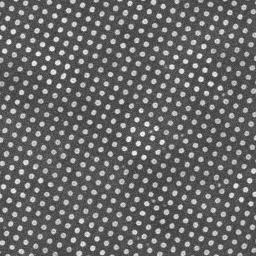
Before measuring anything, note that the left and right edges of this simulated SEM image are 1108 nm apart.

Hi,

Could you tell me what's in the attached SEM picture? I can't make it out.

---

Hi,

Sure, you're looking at a regular array of raised bodies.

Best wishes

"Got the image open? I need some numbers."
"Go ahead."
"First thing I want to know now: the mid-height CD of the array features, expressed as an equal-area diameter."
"20.1 nm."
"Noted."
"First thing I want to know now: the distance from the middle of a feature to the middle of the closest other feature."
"0.0443 microns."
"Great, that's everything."